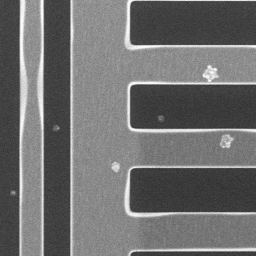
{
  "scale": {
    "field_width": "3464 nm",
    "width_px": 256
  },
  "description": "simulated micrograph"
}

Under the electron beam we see groups of lines, slits or small figures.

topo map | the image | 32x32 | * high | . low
...**....*******................
...**....*******................
...**....*******................
...**....*******................
...**....*******................
...**....*******................
...**....***********************
...**....***********************
...**....***********************
...**....***********************
...**....********...............
...**....*******................
...**....*******................
...**....*******................
...**....*******................
...**....*******................
...**....***********************
...**....***********************
...**....***********************
...**....***********************
...**....***********************
...**....*******................
...**....*******................
...**....*******................
...**....*******................
...**....*******................
...**....*******................
...**....***********************
...**....***********************
...**....***********************
...**....***********************
...**....********...............